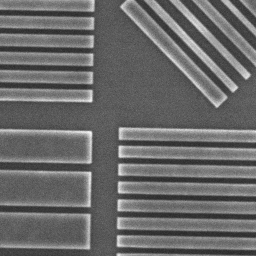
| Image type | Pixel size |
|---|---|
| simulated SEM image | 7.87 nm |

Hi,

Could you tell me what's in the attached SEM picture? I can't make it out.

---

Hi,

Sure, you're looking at groups of lines, slits or small figures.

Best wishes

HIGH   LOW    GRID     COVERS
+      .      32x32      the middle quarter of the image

............................++++
..............................++
+++++++.......................++
+++++++........................+
+++++++.........................
................................
................................
+++++++.........................
+++++++.........................
................................
................................
................................
................................
................................
................................
................................
..............++++++++++++++++++
+++++++.......++++++++++++++++++
+++++++.......++++++++++++++++++
+++++++.........................
+++++++.........................
+++++++.......++++++++++++++++++
+++++++.......++++++++++++++++++
+++++++...............++++++++++
+++++++.........................
..............++++++++++++++++++
..............++++++++++++++++++
+++++++.......++++++++++++++++++
+++++++.........................
+++++++.........................
+++++++.......++++++++++++++++++
+++++++.......++++++++++++++++++